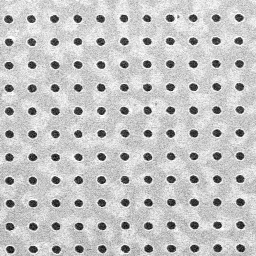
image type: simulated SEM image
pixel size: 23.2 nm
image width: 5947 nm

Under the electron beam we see a regular array of holes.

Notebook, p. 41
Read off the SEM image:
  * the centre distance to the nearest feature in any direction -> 530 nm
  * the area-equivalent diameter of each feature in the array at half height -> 9.31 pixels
